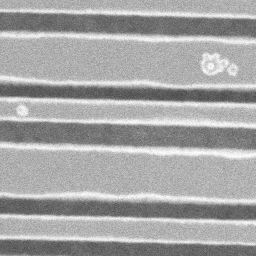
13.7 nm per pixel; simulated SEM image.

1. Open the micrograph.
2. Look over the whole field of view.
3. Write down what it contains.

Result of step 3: lines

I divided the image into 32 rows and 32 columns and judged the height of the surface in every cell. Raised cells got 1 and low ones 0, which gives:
11111111111111111111111111111111
00011111111111111111111111111111
00000000000000000000000000000000
00000000000000000000000000000000
11111111111111000000000000000000
11111111111111111111111111111111
11111111111111111111111111111111
11111111111111111111111111111111
11111111111111111111111111111111
11111111111111111111111111111111
00000001011111111111111111111111
00000000000000000000000000000000
11111111111111000000000000000000
11111111111111111111111111111111
11111111111111111111111111111111
00000000000000000011111111111111
00000000000000000000000000000000
00000000000000000000000000000000
11111111111111000000000000000000
11111111111111111111111111111111
11111111111111111111111111111111
11111111111111111111111111111111
11111111111111111111111111111111
11111111111111111111111111111111
11111111111111111111111111111111
00000000000000000000000000000000
00000000000000000000000000000000
11111111111111111111111111100000
11111111111111111111111111111111
11111111111111111111111111111111
00000000000000000000000000000011
00000000000000000000000000000000